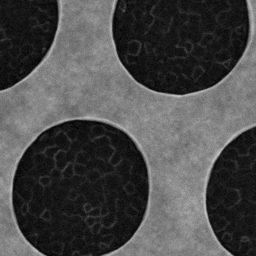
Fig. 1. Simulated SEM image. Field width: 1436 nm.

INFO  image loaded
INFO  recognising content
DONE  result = holes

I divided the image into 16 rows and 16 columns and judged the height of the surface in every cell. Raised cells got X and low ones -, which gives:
----XXX---------
----XXX---------
---XXXX---------
---XXXX--------X
--XXXXXX------XX
-XXXXXXXX----XXX
XXXXXXXXXXXXXXXX
XXXXXXXXXXXXXXXX
XX------XXXXXXX-
XX-------XXXXX--
X--------XXXX---
X--------XXXX---
X--------XXXX---
X--------XXXX---
X-------XXXXX---
XX-----XXXXXXX--